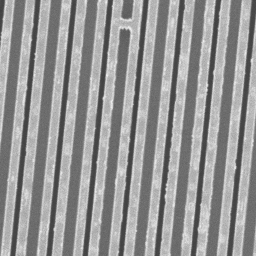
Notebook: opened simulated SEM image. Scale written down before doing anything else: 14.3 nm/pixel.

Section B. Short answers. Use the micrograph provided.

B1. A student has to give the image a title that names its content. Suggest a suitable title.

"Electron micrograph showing parallel lines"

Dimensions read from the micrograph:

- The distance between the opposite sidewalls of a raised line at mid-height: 141 nm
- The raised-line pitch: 256 nm